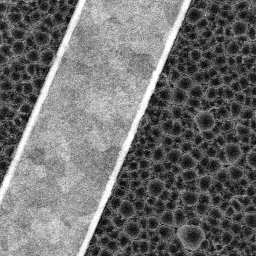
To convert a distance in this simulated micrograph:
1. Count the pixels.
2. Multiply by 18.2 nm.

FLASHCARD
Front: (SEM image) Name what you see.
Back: one or a few lines or trenches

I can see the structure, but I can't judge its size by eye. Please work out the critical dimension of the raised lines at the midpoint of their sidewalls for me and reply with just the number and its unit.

1750 nm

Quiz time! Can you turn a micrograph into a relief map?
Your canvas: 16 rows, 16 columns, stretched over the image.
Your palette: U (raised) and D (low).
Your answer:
DDDDDUUUUUUUDDDD
DDDDDUUUUUUDDDDD
DDDDUUUUUUUDDDDD
DDDDUUUUUUDDDDDD
DDDUUUUUUUDDDDDD
DDDUUUUUUDDDDDDD
DDUUUUUUUDDDDDDD
DDUUUUUUUDDDDDDD
DDUUUUUUDDDDDDDD
DUUUUUUUDDDDDDDD
DUUUUUUDDDDDDDDD
UUUUUUUDDDDDDDDD
UUUUUUUDDDDDDDDD
UUUUUUDDDDDDDDDD
UUUUUUDDDDDDDDDD
UUUUUDDDDDDDDDDD